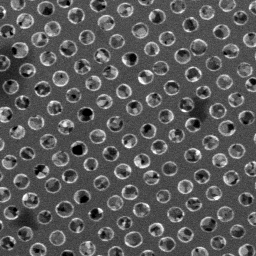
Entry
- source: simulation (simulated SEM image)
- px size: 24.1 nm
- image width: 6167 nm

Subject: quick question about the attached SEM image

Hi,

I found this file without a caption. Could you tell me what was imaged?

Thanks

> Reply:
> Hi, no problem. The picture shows a regular array of raised bodies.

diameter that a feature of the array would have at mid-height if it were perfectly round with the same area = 14.4 px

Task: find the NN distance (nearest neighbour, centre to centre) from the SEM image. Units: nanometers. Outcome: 494